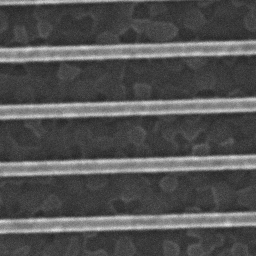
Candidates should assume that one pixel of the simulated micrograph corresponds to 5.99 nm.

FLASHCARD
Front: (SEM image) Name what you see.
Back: parallel lines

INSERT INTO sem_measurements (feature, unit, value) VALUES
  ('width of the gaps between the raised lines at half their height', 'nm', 272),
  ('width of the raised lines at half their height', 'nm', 70.4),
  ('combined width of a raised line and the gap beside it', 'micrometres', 0.342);